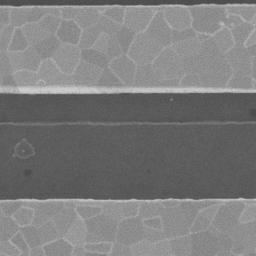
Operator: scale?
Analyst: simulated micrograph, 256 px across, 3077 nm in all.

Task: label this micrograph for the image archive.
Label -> lines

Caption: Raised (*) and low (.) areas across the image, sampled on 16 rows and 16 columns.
****************
****************
****************
****************
****************
****************
................
................
................
................
................
................
.*****..*.******
****************
****************
****************